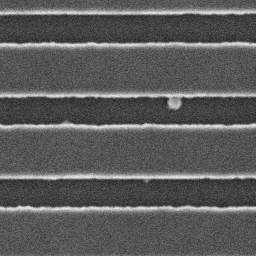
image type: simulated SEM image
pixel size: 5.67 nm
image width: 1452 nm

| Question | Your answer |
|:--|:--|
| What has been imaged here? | lines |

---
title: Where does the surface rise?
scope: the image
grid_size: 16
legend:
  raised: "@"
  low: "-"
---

@@@@@@@@@@@@@@@@
----------------
----------------
@@@@@@@@@@@@@@@@
@@@@@@@@@@@@@@@@
@@@@@@@@@@@@@@@@
----------------
----------------
@@@@@@@@@@@@@@@@
@@@@@@@@@@@@@@@@
@@@@@@@@@@@@@@@@
----------------
----------------
@@@@@@@@@@@@@@@@
@@@@@@@@@@@@@@@@
@@@@@@@@@@@@@@@@